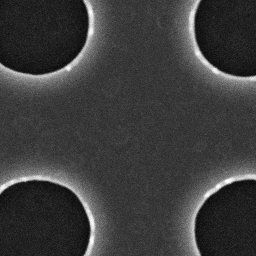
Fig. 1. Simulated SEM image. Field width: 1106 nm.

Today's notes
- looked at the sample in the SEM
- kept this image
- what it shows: holes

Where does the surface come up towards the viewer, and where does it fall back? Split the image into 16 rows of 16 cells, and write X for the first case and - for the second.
-----XXXXXXX----
------XXXXXX----
-----XXXXXXX----
-----XXXXXXXX---
X--XXXXXXXXXXX--
XXXXXXXXXXXXXXXX
XXXXXXXXXXXXXXXX
XXXXXXXXXXXXXXXX
XXXXXXXXXXXXXXXX
XXXXXXXXXXXXXXXX
XXXXXXXXXXXXXXXX
X---XXXXXXXXXX--
-----XXXXXXXX---
-----XXXXXXX----
------XXXXXX----
-----XXXXXXX----